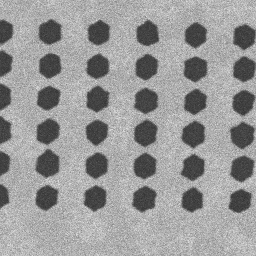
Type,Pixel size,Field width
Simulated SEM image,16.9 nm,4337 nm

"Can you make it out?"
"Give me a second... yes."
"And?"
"a regular array of holes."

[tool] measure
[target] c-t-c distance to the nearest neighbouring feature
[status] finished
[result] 0.555 microns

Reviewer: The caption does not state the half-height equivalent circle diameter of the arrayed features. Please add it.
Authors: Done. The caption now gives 406 nm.